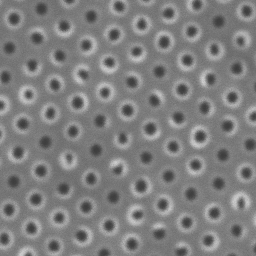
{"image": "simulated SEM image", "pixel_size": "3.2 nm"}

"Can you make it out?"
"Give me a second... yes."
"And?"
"a regular array of holes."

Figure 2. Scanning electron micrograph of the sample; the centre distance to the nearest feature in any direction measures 91.5 nm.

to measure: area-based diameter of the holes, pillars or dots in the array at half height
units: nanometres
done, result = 38.8